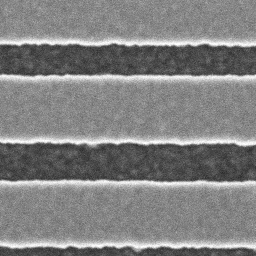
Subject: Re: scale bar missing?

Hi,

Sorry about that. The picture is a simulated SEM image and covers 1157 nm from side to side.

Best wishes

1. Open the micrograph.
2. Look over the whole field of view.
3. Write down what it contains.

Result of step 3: lines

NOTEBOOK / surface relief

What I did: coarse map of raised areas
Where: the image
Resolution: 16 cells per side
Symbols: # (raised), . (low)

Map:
################
################
################
................
................
################
################
################
################
................
................
################
################
################
################
................